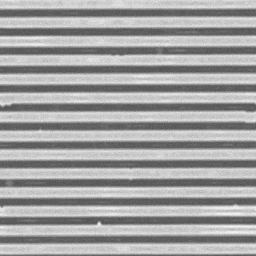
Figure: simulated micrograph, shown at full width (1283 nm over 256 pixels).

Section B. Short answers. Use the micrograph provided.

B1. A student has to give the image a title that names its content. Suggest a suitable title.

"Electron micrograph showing parallel lines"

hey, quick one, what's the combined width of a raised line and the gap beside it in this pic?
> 94.7 nm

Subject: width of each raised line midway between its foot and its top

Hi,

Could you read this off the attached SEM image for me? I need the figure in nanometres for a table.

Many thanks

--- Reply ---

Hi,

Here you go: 55.1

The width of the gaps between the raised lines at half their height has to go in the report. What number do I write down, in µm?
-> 0.0413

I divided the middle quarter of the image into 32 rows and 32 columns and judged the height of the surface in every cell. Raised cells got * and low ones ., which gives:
................................
................................
............**.......***********
********************************
********************************
................................
................................
********************************
********************************
********************************
................................
................................
********************************
********************************
................................
................................
................................
********************************
********************************
................................
................................
********************************
********************************
********************************
................................
................................
********************************
********************************
********************************
................................
................................
********************************